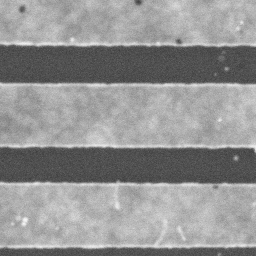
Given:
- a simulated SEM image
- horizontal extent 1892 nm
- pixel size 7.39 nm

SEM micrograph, lines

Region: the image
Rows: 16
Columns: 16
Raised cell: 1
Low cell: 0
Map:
1111111111111111
1111111111111111
1111111111111111
0000000000000000
0000000000000000
1111111111111111
1111111111111111
1111111111111111
1111111111111111
0000000000000000
0000000000000000
1111111111111010
1111111111111111
1111111111111111
1111111111111111
0000000000000000